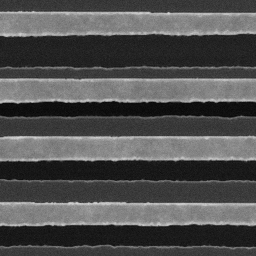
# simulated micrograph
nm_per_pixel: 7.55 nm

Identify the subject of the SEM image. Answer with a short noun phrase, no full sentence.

lines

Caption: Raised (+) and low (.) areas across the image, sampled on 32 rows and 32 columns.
++++++++++++++++++++++++++++++++
++++++++++++++++++++++++++++++++
++++++++++++++++++++++++++++++++
++++++++++++++++++++++++++++++++
++++............................
................................
................................
................................
++..+++++...+...++++.++.++++++++
++++++++++++++++++++++++++++++++
++++++++++++++++++++++++++++++++
++++++++++++++++++++++++++++++++
++++++++++++++++++++++++++++++++
................................
................................
++++++++++++++++++++++++++++++++
++++++++++++++++++++++++++++++++
++++++++++++++++++++++++++++++++
++++++++++++++++++++++++++++++++
++++++++++++++++++++++++++++++++
................................
................................
++..............................
++++++++++++++++++++++++++++++++
++++++++++++++++++++++++++++++++
++++++++++++++++++++++++++++++++
++++++++++++++++++++++++++++++++
++++++++++++++++++++++++++++++++
................................
................................
................................
++++++++++++++++++++++++++++++++